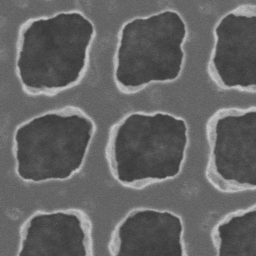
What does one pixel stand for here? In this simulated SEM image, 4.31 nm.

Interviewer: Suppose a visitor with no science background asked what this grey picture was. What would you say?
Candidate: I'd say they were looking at holes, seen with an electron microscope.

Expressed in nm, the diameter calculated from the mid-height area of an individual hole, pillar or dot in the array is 315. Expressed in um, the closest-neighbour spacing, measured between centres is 0.41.